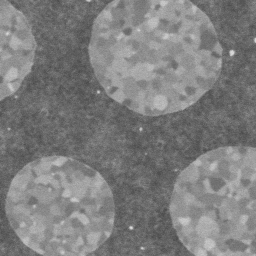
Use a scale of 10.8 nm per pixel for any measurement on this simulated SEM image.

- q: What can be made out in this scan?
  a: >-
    raised bodies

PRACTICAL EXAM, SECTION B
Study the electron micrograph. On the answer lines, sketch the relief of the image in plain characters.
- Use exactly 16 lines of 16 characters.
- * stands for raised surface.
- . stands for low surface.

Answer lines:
*......*****....
**....*******...
**....********..
**....********..
**....********..
*.....*******...
........****....
................
................
.............***
.*****......****
.******....*****
*******....*****
*******....*****
.******....*****
..****......****